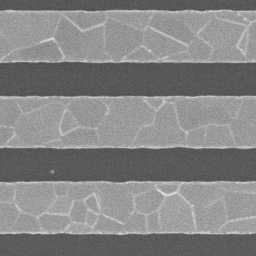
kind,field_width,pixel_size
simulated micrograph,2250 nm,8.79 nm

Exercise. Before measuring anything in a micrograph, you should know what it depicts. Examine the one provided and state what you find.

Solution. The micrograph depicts wiring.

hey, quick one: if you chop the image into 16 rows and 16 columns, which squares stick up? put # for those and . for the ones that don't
................
################
################
################
................
................
################
################
################
................
................
################
################
################
################
................